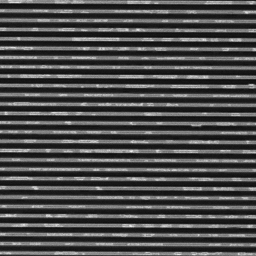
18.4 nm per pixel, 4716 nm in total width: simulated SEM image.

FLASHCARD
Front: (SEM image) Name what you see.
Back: parallel lines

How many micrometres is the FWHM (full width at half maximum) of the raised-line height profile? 0.0691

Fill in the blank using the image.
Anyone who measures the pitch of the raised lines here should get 172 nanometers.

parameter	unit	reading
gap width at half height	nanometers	106